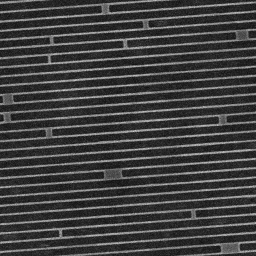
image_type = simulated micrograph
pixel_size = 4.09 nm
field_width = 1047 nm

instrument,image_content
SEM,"parallel lines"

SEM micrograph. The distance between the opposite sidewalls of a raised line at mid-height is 6.6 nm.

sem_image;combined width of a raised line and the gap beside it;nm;37.6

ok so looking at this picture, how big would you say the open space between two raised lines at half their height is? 0.0326 micrometres